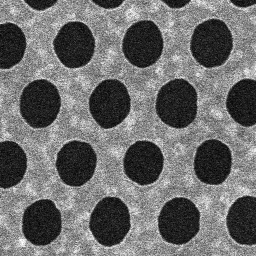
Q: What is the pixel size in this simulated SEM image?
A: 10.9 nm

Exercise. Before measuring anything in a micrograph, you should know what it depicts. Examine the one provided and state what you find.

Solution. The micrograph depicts a regular array of holes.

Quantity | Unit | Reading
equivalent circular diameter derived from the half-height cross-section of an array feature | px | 44.9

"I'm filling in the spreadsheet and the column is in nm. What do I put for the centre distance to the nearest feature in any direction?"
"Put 740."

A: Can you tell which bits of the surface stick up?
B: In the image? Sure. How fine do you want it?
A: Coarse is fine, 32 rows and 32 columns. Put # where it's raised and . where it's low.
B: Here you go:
###....#####...######..######...
################################
##########################..####
...#####...#####....####.....###
...####.....####....####.....###
...####.....###.....####.....###
...####.....###.....####.....###
...####....#####....####....####
.########.################.#####
################################
###....#####...######...#####...
###....#####....####.....####...
###.....###.....####.....###....
##......###.....###......###....
###....####.....####....#####...
###...######...######...######..
################################
##########################.#####
...#####....####....#####....###
...####.....###.....####.....###
...####.....###.....####.....###
...####.....####....####.....###
...#####...#####....#####...####
.###############################
################################
####...#####....#####...#####...
###....####.....####.....###....
###.....###.....####.....###....
###.....###.....####.....###....
###....#####....####....#####...
####..#######..#######.#######..
################################